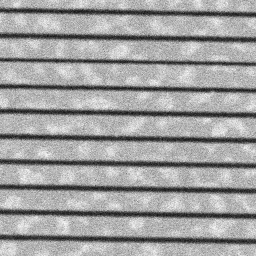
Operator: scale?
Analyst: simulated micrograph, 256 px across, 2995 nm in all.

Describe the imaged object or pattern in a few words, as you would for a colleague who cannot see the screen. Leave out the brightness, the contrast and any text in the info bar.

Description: parallel lines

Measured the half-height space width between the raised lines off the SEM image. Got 59.9 nanometers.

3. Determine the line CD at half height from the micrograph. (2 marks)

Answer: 19.5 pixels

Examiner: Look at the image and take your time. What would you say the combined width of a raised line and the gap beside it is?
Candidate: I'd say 295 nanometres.